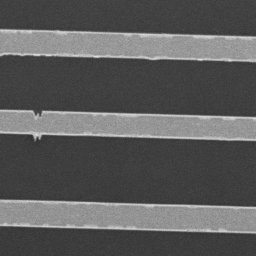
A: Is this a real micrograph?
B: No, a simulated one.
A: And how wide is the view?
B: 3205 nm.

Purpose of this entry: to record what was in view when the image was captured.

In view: one or a few lines or trenches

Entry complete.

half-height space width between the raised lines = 0.774 µm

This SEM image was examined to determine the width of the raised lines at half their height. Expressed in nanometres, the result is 305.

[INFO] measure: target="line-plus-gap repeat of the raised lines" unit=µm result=1.07